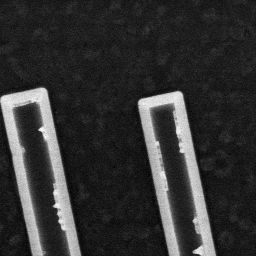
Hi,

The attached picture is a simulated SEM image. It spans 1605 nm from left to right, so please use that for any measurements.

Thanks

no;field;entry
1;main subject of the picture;one or a few lines or trenches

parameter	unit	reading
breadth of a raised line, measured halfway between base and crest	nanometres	233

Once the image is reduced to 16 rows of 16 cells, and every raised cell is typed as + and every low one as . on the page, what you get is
................
................
................
................
................
................
.++......++.....
.++......++.....
.++......+++....
.++.......++....
.+++......++....
.+++......++....
..++......++....
..++......+++...
..++.......++...
..+++......++...